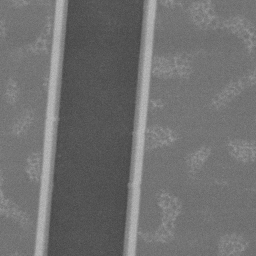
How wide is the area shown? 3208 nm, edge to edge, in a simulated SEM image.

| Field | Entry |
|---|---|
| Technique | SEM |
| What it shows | one or a few lines or trenches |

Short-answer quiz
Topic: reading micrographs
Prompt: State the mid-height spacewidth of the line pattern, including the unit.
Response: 1160 nanometres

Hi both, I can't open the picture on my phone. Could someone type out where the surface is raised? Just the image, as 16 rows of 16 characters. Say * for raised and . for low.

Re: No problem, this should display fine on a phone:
****......******
****.....*******
****.....*******
***......*******
***......*******
***......*******
***......*******
***......*******
***......*******
***......*******
***......*******
***......*******
***.....********
***.....********
***.....********
**......********